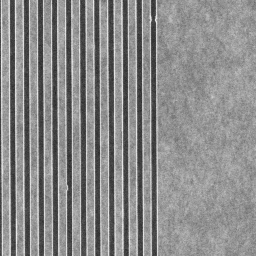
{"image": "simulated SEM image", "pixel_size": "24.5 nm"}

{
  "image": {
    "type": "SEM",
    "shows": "parallel lines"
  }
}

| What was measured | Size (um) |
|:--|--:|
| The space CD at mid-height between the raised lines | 0.184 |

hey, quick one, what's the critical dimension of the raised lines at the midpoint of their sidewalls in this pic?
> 159 nm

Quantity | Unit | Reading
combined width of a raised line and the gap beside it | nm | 345